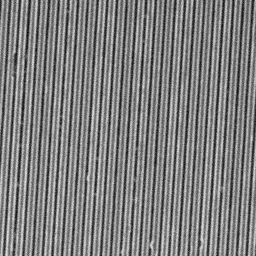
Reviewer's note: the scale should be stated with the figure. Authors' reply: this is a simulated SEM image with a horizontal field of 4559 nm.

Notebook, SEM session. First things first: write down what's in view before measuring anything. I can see parallel lines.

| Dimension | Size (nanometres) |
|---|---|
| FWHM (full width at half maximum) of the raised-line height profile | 107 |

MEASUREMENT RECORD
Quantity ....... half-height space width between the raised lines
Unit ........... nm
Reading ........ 75.5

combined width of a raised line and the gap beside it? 173 nm